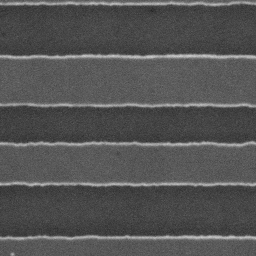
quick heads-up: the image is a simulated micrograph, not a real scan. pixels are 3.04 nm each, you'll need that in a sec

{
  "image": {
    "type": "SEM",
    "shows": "lines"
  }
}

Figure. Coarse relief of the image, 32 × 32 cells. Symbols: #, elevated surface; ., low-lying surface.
###.###......########.#######...
................................
................................
................................
................................
................................
................................
################################
################################
################################
################################
################################
################################
................................
................................
................................
................................
................................
################################
################################
################################
################################
################################
................................
................................
................................
................................
................................
................................
................................
################################
################################